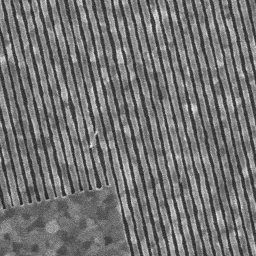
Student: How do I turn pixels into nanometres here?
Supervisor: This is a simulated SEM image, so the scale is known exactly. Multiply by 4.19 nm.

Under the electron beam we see parallel lines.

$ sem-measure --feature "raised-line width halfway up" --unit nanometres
20.9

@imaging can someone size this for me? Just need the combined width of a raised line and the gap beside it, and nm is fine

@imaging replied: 37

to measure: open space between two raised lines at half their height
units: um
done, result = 0.0143